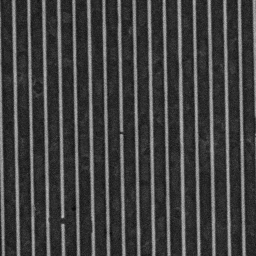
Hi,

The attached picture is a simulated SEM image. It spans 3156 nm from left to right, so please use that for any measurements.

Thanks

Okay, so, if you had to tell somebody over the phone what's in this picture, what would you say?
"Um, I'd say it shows parallel lines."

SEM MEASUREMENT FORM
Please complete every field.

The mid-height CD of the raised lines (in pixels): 2.5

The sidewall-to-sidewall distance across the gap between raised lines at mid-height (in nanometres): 159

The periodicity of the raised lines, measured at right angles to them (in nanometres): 186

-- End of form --